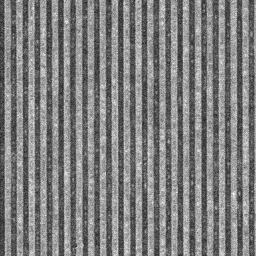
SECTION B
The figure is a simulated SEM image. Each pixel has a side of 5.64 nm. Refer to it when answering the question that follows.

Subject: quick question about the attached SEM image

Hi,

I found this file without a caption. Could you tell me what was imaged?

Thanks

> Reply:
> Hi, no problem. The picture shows parallel lines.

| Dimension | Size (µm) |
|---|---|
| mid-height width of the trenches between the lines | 0.0373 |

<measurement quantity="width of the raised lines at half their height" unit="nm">31.7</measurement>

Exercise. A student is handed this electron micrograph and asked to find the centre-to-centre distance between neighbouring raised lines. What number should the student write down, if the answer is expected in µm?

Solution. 0.067